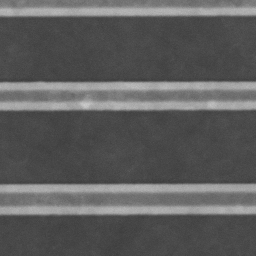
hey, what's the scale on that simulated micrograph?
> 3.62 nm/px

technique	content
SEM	one or a few lines or trenches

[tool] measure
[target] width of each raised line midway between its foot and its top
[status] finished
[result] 0.0774 micrometres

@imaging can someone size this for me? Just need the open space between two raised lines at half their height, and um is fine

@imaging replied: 0.28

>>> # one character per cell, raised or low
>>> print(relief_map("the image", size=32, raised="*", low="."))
********************************
***********.....................
................................
................................
................................
................................
................................
................................
................................
................................
................................
********************************
********************************
................................
................................
................................
................................
................................
................................
................................
................................
................................
................................
.....................***********
********************************
********************************
................................
................................
................................
................................
................................
................................